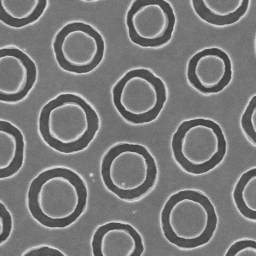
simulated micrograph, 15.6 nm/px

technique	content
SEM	ring-shaped grooves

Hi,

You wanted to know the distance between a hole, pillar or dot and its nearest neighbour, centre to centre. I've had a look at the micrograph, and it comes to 1150 nanometres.